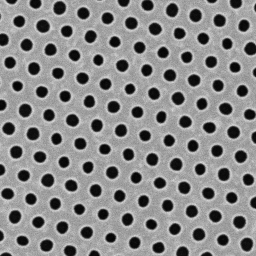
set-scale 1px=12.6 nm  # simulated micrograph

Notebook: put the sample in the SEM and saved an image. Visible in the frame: a regular array of holes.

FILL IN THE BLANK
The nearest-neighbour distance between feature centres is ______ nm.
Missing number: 306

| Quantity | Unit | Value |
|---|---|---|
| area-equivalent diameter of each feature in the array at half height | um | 0.153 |